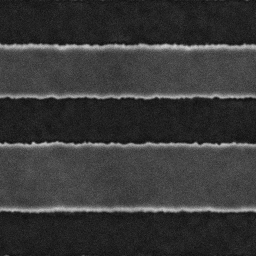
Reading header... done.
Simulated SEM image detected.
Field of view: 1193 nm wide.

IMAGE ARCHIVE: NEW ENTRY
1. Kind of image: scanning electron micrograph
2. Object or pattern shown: lines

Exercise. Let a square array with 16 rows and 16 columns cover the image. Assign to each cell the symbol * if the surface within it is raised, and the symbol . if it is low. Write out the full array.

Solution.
................
................
................
****************
****************
****************
................
................
................
****************
****************
****************
****************
................
................
................